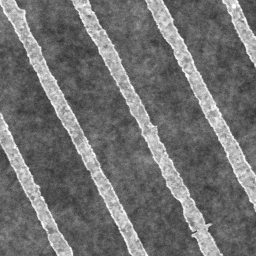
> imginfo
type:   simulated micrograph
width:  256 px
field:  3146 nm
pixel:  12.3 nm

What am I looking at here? one or a few lines or trenches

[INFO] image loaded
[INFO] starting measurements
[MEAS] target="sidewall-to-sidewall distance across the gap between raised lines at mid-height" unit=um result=0.651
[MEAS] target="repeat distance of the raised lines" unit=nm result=805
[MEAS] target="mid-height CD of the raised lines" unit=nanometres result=153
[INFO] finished